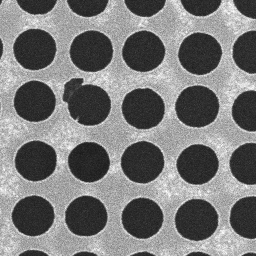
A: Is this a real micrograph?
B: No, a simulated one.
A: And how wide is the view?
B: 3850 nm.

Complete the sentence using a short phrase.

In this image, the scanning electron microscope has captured a regular array of holes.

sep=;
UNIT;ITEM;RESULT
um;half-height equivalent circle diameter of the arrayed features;0.642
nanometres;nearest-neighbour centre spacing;798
